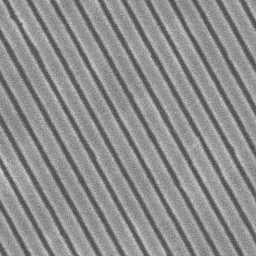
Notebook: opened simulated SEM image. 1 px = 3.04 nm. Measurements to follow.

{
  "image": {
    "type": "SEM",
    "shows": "parallel lines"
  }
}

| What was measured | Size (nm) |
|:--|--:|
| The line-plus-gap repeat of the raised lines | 62.8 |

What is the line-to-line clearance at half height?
18.6 nanometers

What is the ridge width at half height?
42.8 nm